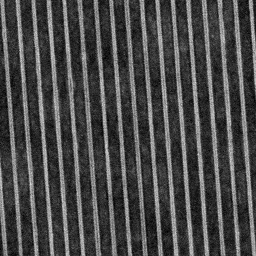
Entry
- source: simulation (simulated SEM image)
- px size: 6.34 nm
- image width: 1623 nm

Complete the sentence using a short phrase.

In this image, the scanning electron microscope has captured parallel lines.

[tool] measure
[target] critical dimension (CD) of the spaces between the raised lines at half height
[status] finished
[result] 0.0791 um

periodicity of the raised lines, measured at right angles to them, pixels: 15.5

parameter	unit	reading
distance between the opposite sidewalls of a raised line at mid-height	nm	18.2